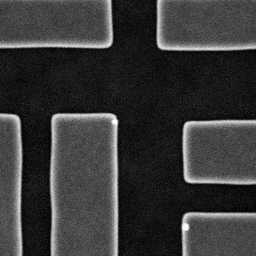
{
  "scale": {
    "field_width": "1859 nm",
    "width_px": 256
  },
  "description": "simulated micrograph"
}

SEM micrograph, groups of lines, slits or small figures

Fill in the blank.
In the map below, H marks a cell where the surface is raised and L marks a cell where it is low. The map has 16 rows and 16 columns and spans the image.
HHHHHHHLLLHHHHHH
HHHHHHHLLLHHHHHH
HHHHHHHLLLHHHHHH
LLLLLLLLLLLLLLLL
LLLLLLLLLLLLLLLL
LLLLLLLLLLLLLLLL
LLLLLLLLLLLLLLLL
HLLHHHHLLLLLLLLL
HLLHHHHLLLLLHHHH
HLLHHHHLLLLLHHHH
HLLHHHHLLLLLHHHH
HLLHHHHLLLLLLLLL
HLLHHHHLLLLLLLLL
HLLHHHHLLLLLHHHH
HLLHHHHLLLLHHHHH
HLLHHHHLLLLHHHHH